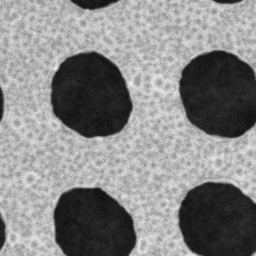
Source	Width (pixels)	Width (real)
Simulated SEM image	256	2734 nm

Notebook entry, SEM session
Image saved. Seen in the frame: holes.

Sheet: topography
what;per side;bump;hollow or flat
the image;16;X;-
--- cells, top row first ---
XXXXX-XXXXXXXXXX
XXXXXXXXXXXXXXXX
XXXXXXXXXXXXXXXX
XXXX---XXXXX---X
XXX-----XXX-----
XXX-----XXX-----
XXX-----XXX-----
XXXX----XXXX----
XXXXX--XXXXXX--X
XXXXXXXXXXXXXXXX
XXXXXXXXXXXXXXXX
XXXXXXXXXXXXX-XX
XXXX---XXXX-----
XXX-----XXX-----
XXX-----XXX-----
XXXX----XXXX----